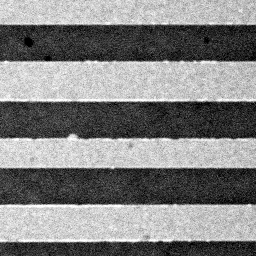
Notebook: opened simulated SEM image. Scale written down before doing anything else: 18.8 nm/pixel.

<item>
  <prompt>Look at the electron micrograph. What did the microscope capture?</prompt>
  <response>lines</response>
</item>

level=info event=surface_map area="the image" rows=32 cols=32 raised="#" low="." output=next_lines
################################
################################
################################
................................
................................
................................
................................
................................
################################
################################
################################
################################
################################
................................
................................
................................
................................
####.###########################
################################
################################
################################
................................
................................
................................
................................
................................
################################
################################
################################
################################
................................
................................